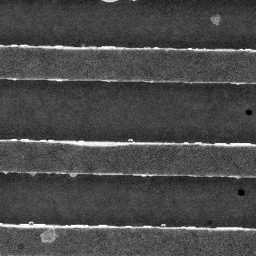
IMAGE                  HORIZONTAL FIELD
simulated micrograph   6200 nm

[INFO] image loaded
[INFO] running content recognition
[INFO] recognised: lines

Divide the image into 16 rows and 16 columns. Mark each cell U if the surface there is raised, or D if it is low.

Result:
DDDDDDDDDDDDDDDD
DDDDDDDDDDDDDDDD
DDDDDDDDDDDDDDDD
UUUUUUUUUUUUUUUU
UUUUUUUUUUUUUUUU
DDDDDDDDDDDDDDDD
DDDDDDDDDDDDDDDD
DDDDDDDDDDDDDDDD
DDDDDDDDDDDDDDDD
UUUUUUUUUUUUUUUU
UUUUUUUUUUUUUUUU
DDDDDDDDDDDDDDDD
DDDDDDDDDDDDDDDD
DDDDDDDDDDDDDDDD
UUUUUUUUUUUUUUUU
UUUUUUUUUUUUUUUU